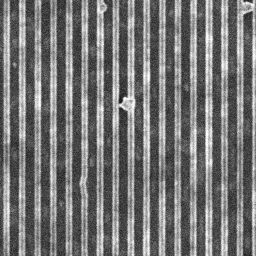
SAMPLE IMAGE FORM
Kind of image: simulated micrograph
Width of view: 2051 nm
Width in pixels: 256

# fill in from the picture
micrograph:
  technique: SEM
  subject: parallel lines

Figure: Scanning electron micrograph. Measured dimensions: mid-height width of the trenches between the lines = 0.0851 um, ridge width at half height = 0.0391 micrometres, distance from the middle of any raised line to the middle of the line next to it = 125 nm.